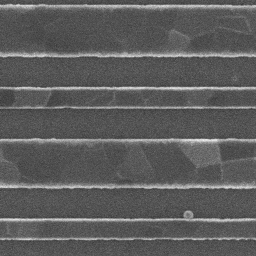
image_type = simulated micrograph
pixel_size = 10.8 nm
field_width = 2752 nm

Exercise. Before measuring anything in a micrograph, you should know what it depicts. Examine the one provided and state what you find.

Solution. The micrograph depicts lines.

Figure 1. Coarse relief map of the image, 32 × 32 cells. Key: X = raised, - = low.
--------------------------------
XXXXXXXXXXXXXXXXXXXXXXXXXXXXXXXX
XXXXXXXXXXXXXXXXXXXXXXXXXXXXXXXX
XXXXXXXXXXXXXXXXXXXXXXXXXXXXXXXX
XXXXXXXXXXXXXXXXXXXXXXXXXXXXXXXX
XXXXXXXXXXXXXXXXXXXXXXXXXXXXXXXX
XXXXXXXXXXXXXXXXXXXXXXXXXXXXXXXX
--------------------------------
--------------------------------
--------------------------------
--------------------------------
XXXXXXXXXXXXXXXXXXXXXXXXXXXXXXXX
XXXXXXXXXXXXXXXXXXXXXXXXXXXXXXXX
--------------------------------
--------------------------------
--------------------------------
--------------------------------
X-XXX-X-----------XXXXXX---XXXXX
XXXXXXXXXXXXXXXXXXXXXXXXXXXXXXXX
XXXXXXXXXXXXXXXXXXXXXXXXXXXXXXXX
XXXXXXXXXXXXXXXXXXXXXXXXXXXXXXXX
XXXXXXXXXXXXXXXXXXXXXXXXXXXXXXXX
XXXXXXXXXXXXXXXXXXXXXXXXXXXXXXXX
--------------------------------
--------------------------------
--------------------------------
--------------------------------
-----XX--------------XXX-------X
XXXXXXXXXXXXXXXXXXXXXXXXXXXXXXXX
XXXXXXXXXXXXXXXXXXXXXXXXXXXXXXXX
--------------------------------
--------------------------------